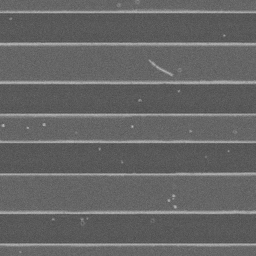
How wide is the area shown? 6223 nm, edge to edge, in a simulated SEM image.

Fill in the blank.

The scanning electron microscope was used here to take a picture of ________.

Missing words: lines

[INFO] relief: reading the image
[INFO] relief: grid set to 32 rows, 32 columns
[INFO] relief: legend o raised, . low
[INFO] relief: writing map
oooooooooooooooooooooooooooooooo
oooooooooooooooooooooooooooooooo
................................
................................
................................
................................
oooooooooooooooooooooooooooooooo
oooooooooooooooooooooooooooooooo
oooooooooooooooooooooooooooooooo
oooooooooooooooooooooooooooooooo
................................
................................
................................
................................
oooooooooooooooooooooooooooooooo
oooooooooooooooooooooooooooooooo
oooooooooooooooooooooooooooooooo
oooooooooooooooooooooooooooooooo
................................
................................
................................
................................
oooooooooooooooooooooooooooooooo
oooooooooooooooooooooooooooooooo
oooooooooooooooooooooooooooooooo
oooooooooooooooooooooooooooooooo
oooooooooooooooooooooooooooooooo
................................
................................
................................
................................
oooooooooooooooooooooooooooooooo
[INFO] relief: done